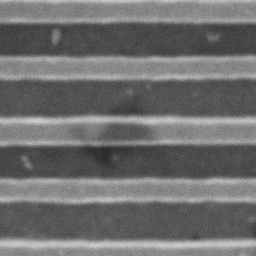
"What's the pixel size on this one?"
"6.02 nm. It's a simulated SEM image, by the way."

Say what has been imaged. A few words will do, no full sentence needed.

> lines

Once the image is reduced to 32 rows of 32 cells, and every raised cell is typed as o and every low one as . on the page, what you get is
oooooooooooooooooooooooooooooooo
oooooooooooooooooooooooooooooooo
oooooooooooooooooooooooooooooooo
................................
................................
................................
................................
oooooooooooooooooooooooooooooooo
oooooooooooooooooooooooooooooooo
oooooooooooooooooooooooooooooooo
................................
................................
................................
................................
................................
oooooooooooooooooooooooooooooooo
oooooooooooooooooooooooooooooooo
oooooooooooooooooooooooooooooooo
................................
................................
................................
................................
oo.oooooooooo..ooooooooo..oo.ooo
oooooooooooooooooooooooooooooooo
oooooooooooooooooooooooooooooooo
................................
................................
................................
................................
................................
................................
oooooooooooooooooooooooooooooooo